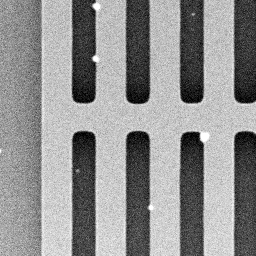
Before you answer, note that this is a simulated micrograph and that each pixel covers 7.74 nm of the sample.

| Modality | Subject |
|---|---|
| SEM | groups of lines, slits or small figures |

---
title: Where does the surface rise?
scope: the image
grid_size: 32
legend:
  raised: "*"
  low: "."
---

.....****...****...***....***...
.....****...****...***....***...
.....****...****...***....***...
.....****...****...***....***...
.....****...****...***....***...
.....****...****...***....***...
.....****...****...***....***...
.....****...****...***....***...
.....****...****...***....***...
.....****...****...***....***...
.....****...****...***....***...
.....****...****...***....***...
.....****...****...****..****...
.....***************************
.....***************************
.....***************************
.....*****.*****..*****..*****..
.....****...****...****..****...
.....****...****...***....***...
.....****...****...***....***...
.....****...****...***....***...
.....****...****...***....***...
.....****...****...***....***...
.....****...****...***....***...
.....****...****...***....***...
.....****...****...***....***...
.....****...****...***....***...
.....****...****...***....***...
.....****...****...***....***...
.....****...****...***....***...
.....****...****...***....***...
.....****...****...***....***...